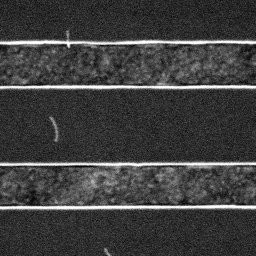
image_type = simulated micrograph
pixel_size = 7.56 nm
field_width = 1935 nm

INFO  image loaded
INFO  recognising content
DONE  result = one or a few lines or trenches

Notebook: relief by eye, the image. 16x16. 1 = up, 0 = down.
1111111111111111
1111111111111111
1111111111111111
0000000000000000
0000000000000000
1111111111111111
1111111111111111
1111111111111111
1111111111111111
1111111111111111
0000000000000000
0000000000000000
0000000000000000
1111111111111111
1111111111111111
1111111111111111